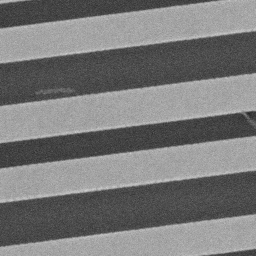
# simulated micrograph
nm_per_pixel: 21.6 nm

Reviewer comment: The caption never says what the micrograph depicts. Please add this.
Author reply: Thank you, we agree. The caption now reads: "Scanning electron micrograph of lines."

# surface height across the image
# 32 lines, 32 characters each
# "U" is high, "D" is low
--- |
DDDDDDDDDDDDDDDDDDDDDDDDUUUUUUUU
DDDDDDDDDDDDDDDDUUUUUUUUUUUUUUUU
DDDDDDDDDUUUUUUUUUUUUUUUUUUUUUUU
UUUUUUUUUUUUUUUUUUUUUUUUUUUUUUUU
UUUUUUUUUUUUUUUUUUUUUUUUUUUDDDDD
UUUUUUUUUUUUUUUUUUUDDDDDDDDDDDDD
UUUUUUUUUUUDDDDDDDDDDDDDDDDDDDDD
UUUDDDDDDDDDDDDDDDDDDDDDDDDDDDDD
DDDDDDDDDDDDDDDDDDDDDDDDDDDDDDDD
DDDDDDDDDDDDDDDDDDDDDDDDDDDDDUUU
DDDDDDDDDDDDDDDDDDDDDDUUUUUUUUUU
DDDDDDDDDDDDDDUUUUUUUUUUUUUUUUUU
DDDDDDDUUUUUUUUUUUUUUUUUUUUUUUUU
UUUUUUUUUUUUUUUUUUUUUUUUUUUUUUUU
UUUUUUUUUUUUUUUUUUUUUUUUUUUDDDDD
UUUUUUUUUUUUUUUUUUUDDDDDDDDDDDDD
UUUUUUUUUUUDDDDDDDDDDDDDDDDDDDDD
UUUDDDDDDDDDDDDDDDDDDDDDDDDDUUUU
DDDDDDDDDDDDDDDDDDDDUUUUUUUUUUUU
DDDDDDDDDDDDDUUUUUUUUUUUUUUUUUUU
DDDDUUUUUUUUUUUUUUUUUUUUUUUUUUUU
UUUUUUUUUUUUUUUUUUUUUUUUUUUUUUDD
UUUUUUUUUUUUUUUUUUUUUUDDDDDDDDDD
UUUUUUUUUUUUUUUDDDDDDDDDDDDDDDDD
UUUUUUUDDDDDDDDDDDDDDDDDDDDDDDDD
DDDDDDDDDDDDDDDDDDDDDDDDDDDDDDDD
DDDDDDDDDDDDDDDDDDDDDDDDDDDDDDDD
DDDDDDDDDDDDDDDDDDDDDDDDDDDUUUUU
DDDDDDDDDDDDDDDDDDDUUUUUUUUUUUUU
DDDDDDDDDDDUUUUUUUUUUUUUUUUUUUUU
DDDUUUUUUUUUUUUUUUUUUUUUUUUUUUUU
UUUUUUUUUUUUUUUUUUUUUUUUUUUUDDDD